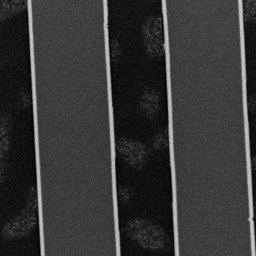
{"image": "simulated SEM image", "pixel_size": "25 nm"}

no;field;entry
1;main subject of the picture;one or a few lines or trenches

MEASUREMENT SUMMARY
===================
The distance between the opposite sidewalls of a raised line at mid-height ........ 1.89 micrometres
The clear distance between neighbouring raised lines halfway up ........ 1.49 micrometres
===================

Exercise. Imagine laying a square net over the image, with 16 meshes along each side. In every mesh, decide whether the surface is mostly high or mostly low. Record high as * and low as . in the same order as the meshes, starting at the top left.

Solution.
..*****...*****.
..*****...*****.
..*****...*****.
..*****...*****.
..*****...*****.
..*****....****.
..*****....****.
..*****....****.
..*****....****.
..*****....****.
..*****....*****
..*****....*****
..*****....*****
...****....*****
...****....*****
...****....*****